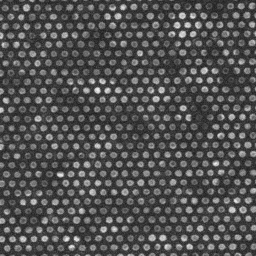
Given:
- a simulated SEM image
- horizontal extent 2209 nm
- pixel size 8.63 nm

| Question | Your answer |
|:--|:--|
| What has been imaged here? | a regular array of raised bodies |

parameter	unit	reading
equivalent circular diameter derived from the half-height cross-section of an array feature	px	5.86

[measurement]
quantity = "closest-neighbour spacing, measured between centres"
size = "89.3 nanometers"